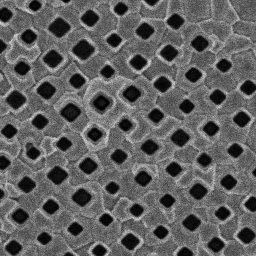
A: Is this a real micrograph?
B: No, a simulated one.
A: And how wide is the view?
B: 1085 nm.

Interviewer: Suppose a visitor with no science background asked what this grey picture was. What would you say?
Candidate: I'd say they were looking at a regular array of holes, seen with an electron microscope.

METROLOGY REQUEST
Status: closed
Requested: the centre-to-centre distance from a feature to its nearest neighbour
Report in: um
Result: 0.136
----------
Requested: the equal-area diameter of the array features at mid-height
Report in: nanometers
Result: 61.5